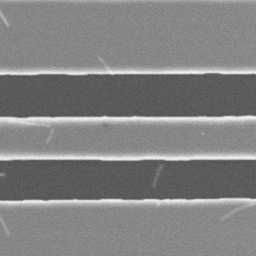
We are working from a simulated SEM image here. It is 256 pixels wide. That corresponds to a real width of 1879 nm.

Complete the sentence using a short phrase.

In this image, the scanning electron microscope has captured lines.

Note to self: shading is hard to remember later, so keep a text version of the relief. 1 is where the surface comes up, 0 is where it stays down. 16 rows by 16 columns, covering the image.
1111111111111111
1111111111111111
1111111111111111
1111111111111111
1111111111111111
0000000000000000
0000000000000000
1111111111111111
1111111111111111
1111111111111111
0000000000000000
0000000000000000
0000001101111111
1111111111111111
1111111111111111
1111111111111111